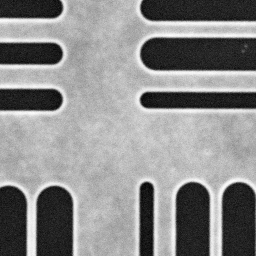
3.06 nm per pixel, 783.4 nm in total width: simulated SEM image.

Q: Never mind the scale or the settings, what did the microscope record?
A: groups of lines, slits or small figures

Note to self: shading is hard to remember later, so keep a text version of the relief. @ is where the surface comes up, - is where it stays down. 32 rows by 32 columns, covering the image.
--------@@@@@@@@@@--------------
--------@@@@@@@@@@--------------
@@@@@@@@@@@@@@@@@@--------------
@@@@@@@@@@@@@@@@@@@@@@@@@@@@@@@@
@@@@@@@@@@@@@@@@@@@@@@@@@@@@@@@@
-------@@@@@@@@@@@--------------
--------@@@@@@@@@---------------
--------@@@@@@@@@@--------------
@@@@@@@@@@@@@@@@@@--------------
@@@@@@@@@@@@@@@@@@@@@@@@@@@@@@@@
@@@@@@@@@@@@@@@@@@@@@@@@@@@@@@@@
-------@@@@@@@@@@@--------------
--------@@@@@@@@@---------------
-------@@@@@@@@@@@--------------
@@@@@@@@@@@@@@@@@@@@@@@@@@@@@@@@
@@@@@@@@@@@@@@@@@@@@@@@@@@@@@@@@
@@@@@@@@@@@@@@@@@@@@@@@@@@@@@@@@
@@@@@@@@@@@@@@@@@@@@@@@@@@@@@@@@
@@@@@@@@@@@@@@@@@@@@@@@@@@@@@@@@
@@@@@@@@@@@@@@@@@@@@@@@@@@@@@@@@
@@@@@@@@@@@@@@@@@@@@@@@@@@@@@@@@
@@@@@@@@@@@@@@@@@@@@@@@@@@@@@@@@
@@@@@@@@@@@@@@@@@@@@@@@@@@@@@@@@
--@@@@--@@@@@@@@@--@@@----@@----
---@@----@@@@@@@@--@@@----@@----
---@-----@@@@@@@@--@@@----@@----
---------@@@@@@@@--@@@----@@----
---------@@@@@@@@--@@@----@@----
---------@@@@@@@@--@@@----@@----
---------@@@@@@@@--@@@----@@----
---------@@@@@@@@--@@@----@@----
---@-----@@@@@@@@--@@@----@@----